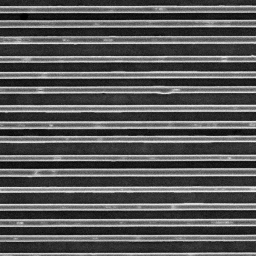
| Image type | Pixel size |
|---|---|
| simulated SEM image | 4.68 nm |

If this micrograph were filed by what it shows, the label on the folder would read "parallel lines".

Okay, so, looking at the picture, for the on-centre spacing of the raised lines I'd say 0.0765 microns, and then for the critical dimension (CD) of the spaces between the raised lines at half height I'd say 0.0456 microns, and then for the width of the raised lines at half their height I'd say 6.75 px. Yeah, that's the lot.